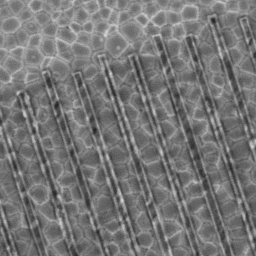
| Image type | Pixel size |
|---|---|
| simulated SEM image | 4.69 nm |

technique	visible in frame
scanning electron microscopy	parallel lines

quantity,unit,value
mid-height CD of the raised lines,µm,0.0368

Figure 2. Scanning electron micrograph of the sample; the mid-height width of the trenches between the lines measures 102 nm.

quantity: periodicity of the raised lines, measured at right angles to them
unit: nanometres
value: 137